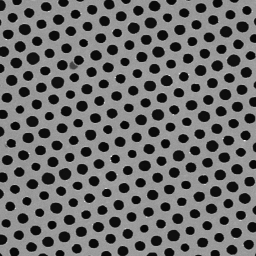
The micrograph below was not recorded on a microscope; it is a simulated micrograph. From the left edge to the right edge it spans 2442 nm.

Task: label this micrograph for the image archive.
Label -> a regular array of holes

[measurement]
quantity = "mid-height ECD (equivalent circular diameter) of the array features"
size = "95.7 nanometres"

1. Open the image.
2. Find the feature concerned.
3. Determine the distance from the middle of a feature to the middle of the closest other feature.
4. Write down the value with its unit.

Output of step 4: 0.162 um